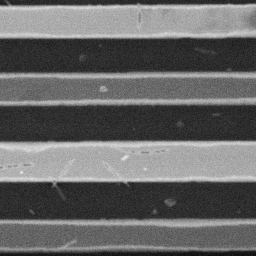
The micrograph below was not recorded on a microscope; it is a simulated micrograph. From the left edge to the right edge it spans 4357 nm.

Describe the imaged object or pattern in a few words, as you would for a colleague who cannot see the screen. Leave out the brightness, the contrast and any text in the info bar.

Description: lines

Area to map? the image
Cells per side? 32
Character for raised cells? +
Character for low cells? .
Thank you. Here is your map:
................................
++++++++++++++++++++++++++++++++
++++++++++++++++++++++++++++++++
++++++++++++++++++++++++++++++++
++++++++++++++++++++++++++++++++
................................
................................
................................
................................
++++++++++++++++++++++++++++++++
++++++++++++++++++++++++++++++++
++++++++++++++++++++++++++++++++
++++++++++++++++++++++++++++++++
................................
................................
................................
................................
................................
++++++++++++++++++++++++++++++++
++++++++++++++++++++++++++++++++
++++++++++++++++++++++++++++++++
++++++++++++++++++++++++++++++++
++++++++++++++++++++++++++++++++
................................
................................
................................
................................
................................
++++++++++++++++++++++++++++++++
++++++++++++++++++++++++++++++++
++++++++++++++++++++++++++++++++
................................